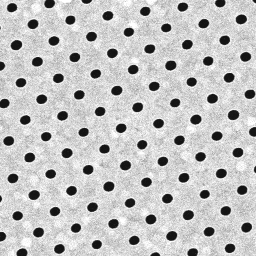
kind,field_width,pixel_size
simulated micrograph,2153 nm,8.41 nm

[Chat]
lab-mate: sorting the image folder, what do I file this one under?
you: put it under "a regular array of holes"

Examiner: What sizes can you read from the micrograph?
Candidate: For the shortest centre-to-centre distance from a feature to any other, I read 0.223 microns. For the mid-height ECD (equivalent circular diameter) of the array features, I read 87.5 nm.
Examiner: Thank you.